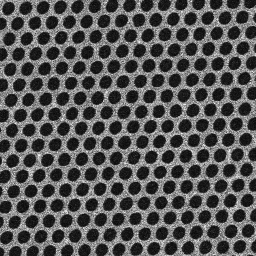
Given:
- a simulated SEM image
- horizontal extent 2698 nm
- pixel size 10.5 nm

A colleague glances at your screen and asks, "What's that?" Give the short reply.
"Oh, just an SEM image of a regular array of holes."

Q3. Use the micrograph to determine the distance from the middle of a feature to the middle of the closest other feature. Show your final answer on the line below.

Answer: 180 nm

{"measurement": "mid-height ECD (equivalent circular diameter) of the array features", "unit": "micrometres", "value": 0.138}